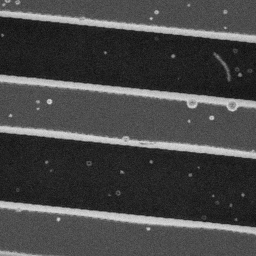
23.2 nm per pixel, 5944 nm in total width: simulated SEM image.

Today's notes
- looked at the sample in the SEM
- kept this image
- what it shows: lines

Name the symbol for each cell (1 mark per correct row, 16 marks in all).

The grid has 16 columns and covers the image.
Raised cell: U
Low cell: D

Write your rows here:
UUUUUUUUUUUUUUUU
DDDDDDUUUUUUUUUU
DDDDDDDDDDDDDDDU
DDDDDDDDDDDDDDDD
DDDDDDDDDDDDDDDD
UUUUUUDDDDDDDDDD
UUUUUUUUUUUUUUUU
UUUUUUUUUUUUUUUU
DDDDUUUUUUUUUUUU
DDDDDDDDDDDDDUUU
DDDDDDDDDDDDDDDD
DDDDDDDDDDDDDDDD
DDDDDDDDDDDDDDDD
UUUUUUUDDDDDDDDD
UUUUUUUUUUUUUUUU
UUUUUUUUUUUUUUUU